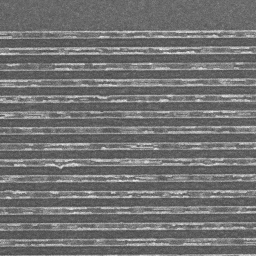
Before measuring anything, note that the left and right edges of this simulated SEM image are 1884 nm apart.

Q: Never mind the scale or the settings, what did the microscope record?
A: parallel lines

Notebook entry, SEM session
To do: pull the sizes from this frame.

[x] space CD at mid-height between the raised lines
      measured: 9.13 pixels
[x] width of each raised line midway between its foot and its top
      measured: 46.9 nm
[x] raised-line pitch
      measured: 0.118 µm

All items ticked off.